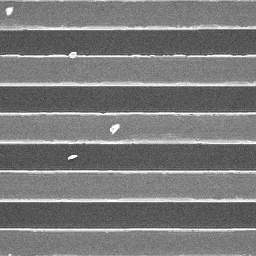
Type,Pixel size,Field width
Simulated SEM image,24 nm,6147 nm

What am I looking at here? lines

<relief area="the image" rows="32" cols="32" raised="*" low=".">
********************************
********************************
********************************
...**********************...****
................................
................................
................................
********************************
********************************
********************************
********************************
................................
................................
................................
********************************
********************************
********************************
********************************
................................
................................
................................
********************************
********************************
********************************
********************************
................................
................................
................................
................................
********************************
********************************
********************************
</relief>